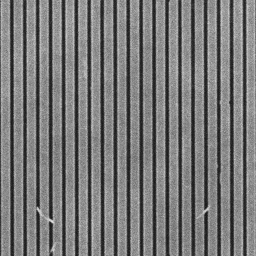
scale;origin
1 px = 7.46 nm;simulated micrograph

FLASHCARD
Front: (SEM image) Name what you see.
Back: parallel lines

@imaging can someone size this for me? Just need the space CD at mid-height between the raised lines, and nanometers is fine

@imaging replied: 31.7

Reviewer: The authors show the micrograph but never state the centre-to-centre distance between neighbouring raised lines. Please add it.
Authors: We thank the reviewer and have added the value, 0.0964 micrometres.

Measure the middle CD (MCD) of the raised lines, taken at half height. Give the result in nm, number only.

62.5